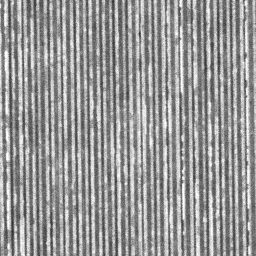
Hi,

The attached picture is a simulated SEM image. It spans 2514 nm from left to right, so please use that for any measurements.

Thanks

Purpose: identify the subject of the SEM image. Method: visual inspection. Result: parallel lines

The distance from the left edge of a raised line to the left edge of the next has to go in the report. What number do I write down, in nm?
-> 63.8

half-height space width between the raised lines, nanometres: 41.7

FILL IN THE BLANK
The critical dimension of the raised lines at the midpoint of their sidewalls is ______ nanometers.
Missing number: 24.5